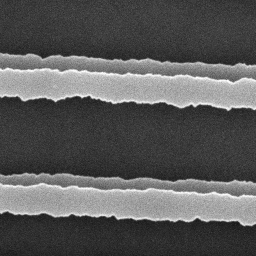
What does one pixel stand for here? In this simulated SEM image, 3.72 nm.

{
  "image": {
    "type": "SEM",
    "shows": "lines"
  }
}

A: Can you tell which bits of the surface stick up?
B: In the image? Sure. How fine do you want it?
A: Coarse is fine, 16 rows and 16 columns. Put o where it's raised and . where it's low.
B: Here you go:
................
................
................
oo..............
oooooooooooooooo
oooooooooooooooo
...........ooooo
................
................
................
................
oooooooooooooooo
oooooooooooooooo
...o..oooooooooo
................
................